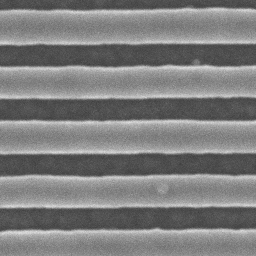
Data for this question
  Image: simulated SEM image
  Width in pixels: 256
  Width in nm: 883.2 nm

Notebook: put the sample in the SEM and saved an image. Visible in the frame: lines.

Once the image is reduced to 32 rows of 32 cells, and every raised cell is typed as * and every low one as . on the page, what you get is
................................
********************************
********************************
********************************
********************************
*************...**..............
................................
................................
********************************
********************************
********************************
********************************
................................
................................
................................
********************************
********************************
********************************
********************************
................................
................................
................................
********************************
********************************
********************************
********************************
................................
................................
................................
********************************
********************************
********************************